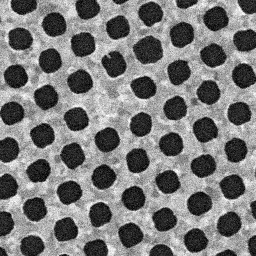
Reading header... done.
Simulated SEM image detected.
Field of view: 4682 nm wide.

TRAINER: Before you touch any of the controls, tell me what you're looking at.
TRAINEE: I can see a regular array of holes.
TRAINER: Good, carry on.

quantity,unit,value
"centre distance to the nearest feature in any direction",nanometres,666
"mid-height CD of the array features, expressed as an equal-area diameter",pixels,25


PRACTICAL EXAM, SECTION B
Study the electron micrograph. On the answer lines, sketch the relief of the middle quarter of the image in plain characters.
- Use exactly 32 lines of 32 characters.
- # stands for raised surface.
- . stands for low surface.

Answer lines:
##########......##########......
#....#####......##########......
#......####....###########......
#......#####.#####....####.....#
#......##########......###....##
#......#########.......#########
##....#####..####......#########
###.######....####.....#########
#########.....#####..#####....##
#########......##########.....##
###.#####......##########......#
#....####.....###########......#
......####...#####...####......#
......###########.....####....##
......##########......##########
#.....##########......##########
##...####....###......##########
########......###....#####...###
########......##########......##
########......##########......##
....####......##########......##
.....####....####...####......##
.....###########.....####....###
.....##########......###########
.....###########.....###########
....####...#####.....##########.
#######.....####....#####...####
#######......###########....####
#######......##########......###
...####......##########......###
....####....#####..####......###
.....####.#####.....####....####